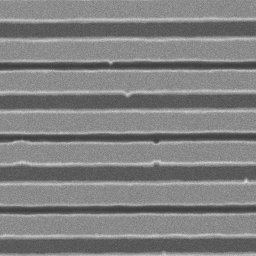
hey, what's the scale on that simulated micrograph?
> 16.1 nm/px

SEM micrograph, parallel lines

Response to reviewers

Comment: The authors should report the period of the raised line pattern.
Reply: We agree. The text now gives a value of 563 nanometers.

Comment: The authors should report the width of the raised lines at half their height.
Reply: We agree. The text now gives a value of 382 nm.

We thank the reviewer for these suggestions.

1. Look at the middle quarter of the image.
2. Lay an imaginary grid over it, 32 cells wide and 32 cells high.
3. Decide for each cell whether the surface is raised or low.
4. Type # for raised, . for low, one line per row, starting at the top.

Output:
................................
.###############################
################################
################################
################################
################################
################################
...............##...............
................................
................................
................................
................................
################################
################################
################################
################################
################################
#.#####............###..........
................................
....##################..########
################################
################################
################################
################################
################################
................................
................................
................................
................................
................................
################################
################################